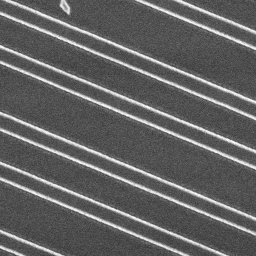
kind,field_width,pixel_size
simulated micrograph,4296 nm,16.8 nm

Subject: lines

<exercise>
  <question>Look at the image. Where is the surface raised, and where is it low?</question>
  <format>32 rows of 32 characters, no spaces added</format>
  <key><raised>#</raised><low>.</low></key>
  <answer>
##................######........
#####................#####......
..#####................#####....
....#####................######.
.......#####................####
.........#####................##
##..........#####...............
####..........#####.............
..#####.........######..........
....#####..........#####........
......######.........######.....
.........#####..........#####...
...........#####..........#####.
..............#####..........###
#...............#####..........#
###...............######........
.#####...............#####......
...#####...............######...
......#####...............#####.
........#####...............####
#.........######...............#
###..........#####..............
#####..........#####............
...#####..........#####.........
.....#####..........#####.......
........#####..........#####....
..........#####..........#####..
............#####..........#####
...............#####..........##
##...............#####..........
####................#####.......
.######...............#####.....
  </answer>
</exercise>